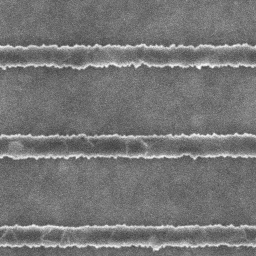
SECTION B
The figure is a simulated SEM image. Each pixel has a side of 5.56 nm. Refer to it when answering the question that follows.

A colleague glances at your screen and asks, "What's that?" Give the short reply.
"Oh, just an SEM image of one or a few lines or trenches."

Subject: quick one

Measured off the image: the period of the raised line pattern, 0.5 micrometres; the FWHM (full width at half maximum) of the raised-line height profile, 109 nm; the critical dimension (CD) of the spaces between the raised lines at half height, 386 nm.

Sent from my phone